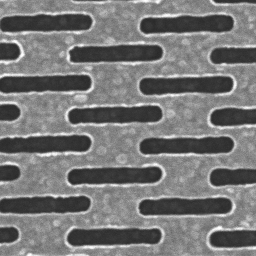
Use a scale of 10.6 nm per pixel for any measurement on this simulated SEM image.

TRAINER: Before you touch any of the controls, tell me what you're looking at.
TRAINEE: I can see a regular array of holes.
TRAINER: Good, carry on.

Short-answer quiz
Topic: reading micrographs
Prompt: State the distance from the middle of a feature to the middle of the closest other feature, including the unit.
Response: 0.645 micrometres